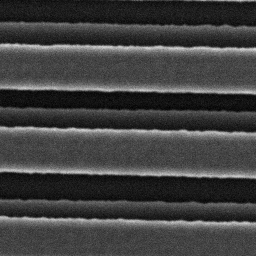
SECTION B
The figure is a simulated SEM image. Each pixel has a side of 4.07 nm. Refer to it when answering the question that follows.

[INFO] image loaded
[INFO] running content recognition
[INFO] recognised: lines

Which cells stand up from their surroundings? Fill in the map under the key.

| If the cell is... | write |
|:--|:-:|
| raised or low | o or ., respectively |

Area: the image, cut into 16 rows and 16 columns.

................
................
................
oooooooooooooooo
oooooooooooooooo
oooooooooooooooo
................
................
oooooooooooooooo
oooooooooooooooo
oooooooooooooooo
................
................
................
oooooooooooooooo
oooooooooooooooo